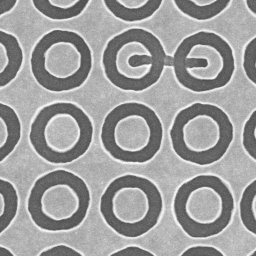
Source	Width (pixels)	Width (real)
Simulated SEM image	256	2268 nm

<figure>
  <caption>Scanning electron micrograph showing a regular array of ring-shaped grooves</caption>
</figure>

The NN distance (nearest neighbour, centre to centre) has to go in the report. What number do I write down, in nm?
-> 620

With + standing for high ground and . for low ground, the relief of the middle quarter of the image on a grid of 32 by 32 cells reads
++++...+++...++++..+++...+......
+++....+++...++++++++....++....+
++....++++....++++++....++++....
......+++++.......+.....++++....
.....+++++++...........++++++...
....+++++++++.........++++++++..
..+++++++++++++.....+++++++++++.
++++++++++++++++++++++++++++++++
++++++++++++++++++++++++++++++++
++++++++++++++++++++++++++++++++
....++++++++++.......+++++++++++
....++++++++..........+++++++...
.....++++++............+++++....
++....++++.....+++++....++++....
+++....+++....+++++++...+++....+
+++....+++...++++++++....++...++
++++...++....++++++++....++...++
++++...++....++++++++....+....++
++++...++....++++++++...+++...++
+++....+++...++++++++...+++...++
++....++++....++++++....+++....+
+.....++++......+++.....++++....
.....++++++............+++++....
...+++++++++..........+++++++...
.++++++++++++++.....++++++++++++
++++++++++++++++++++++++++++++++
++++++++++++++++++++++++++++++++
..++++++++++++++++++++++++++++++
....+++++++++........+++++++++++
.....+++++++..........++++++++..
+.....+++++............++++++...
++....++++....+++++....++++++...